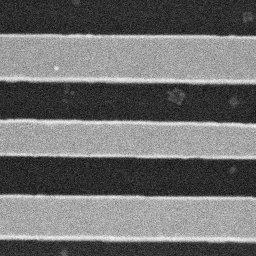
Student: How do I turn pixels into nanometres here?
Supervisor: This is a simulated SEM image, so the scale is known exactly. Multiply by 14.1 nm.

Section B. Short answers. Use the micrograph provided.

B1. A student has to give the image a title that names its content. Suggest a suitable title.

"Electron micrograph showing lines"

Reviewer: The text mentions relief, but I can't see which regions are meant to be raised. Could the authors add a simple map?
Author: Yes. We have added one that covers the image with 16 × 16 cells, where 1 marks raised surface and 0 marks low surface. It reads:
0000000000000000
0000000000000000
1111111111111111
1111111111111111
1111111111111111
0000000000000000
0000000000000000
1110000000000000
1111111111111111
1111111111111111
0000000000000000
0000000000000000
1111111111111111
1111111111111111
1111111111111111
0000000000000000